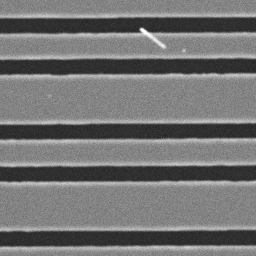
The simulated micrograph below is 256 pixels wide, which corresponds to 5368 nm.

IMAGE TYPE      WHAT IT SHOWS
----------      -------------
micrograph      lines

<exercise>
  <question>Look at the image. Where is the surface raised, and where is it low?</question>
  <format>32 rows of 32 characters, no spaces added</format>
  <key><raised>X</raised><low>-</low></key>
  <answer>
XXXXXXXXXXXXXXXXXXXXXXXXXXXXXXXX
XXXXXXXXXXXXXXXXXXXXXXXXXXXXXXXX
--------------------------------
--------------------------------
XXXXXXXXXXXXXXXXXXXXXXXXXXXXXXXX
XXXXXXXXXXXXXXXXXXXXXXXXXXXXXXXX
XXXXXXXXXXXXXXXXXXXXXXXXXXXXXXXX
--------------------------------
--------------------------------
XXXXXXXXXXXXXXXXXXXXXXXXXXXXXXXX
XXXXXXXXXXXXXXXXXXXXXXXXXXXXXXXX
XXXXXXXXXXXXXXXXXXXXXXXXXXXXXXXX
XXXXXXXXXXXXXXXXXXXXXXXXXXXXXXXX
XXXXXXXXXXXXXXXXXXXXXXXXXXXXXXXX
XXXXXXXXXXXXXXXXXXXXXXXXXXXXXXXX
--------------------------------
--------------------------------
XXXXXXXXXXXXXXXXXXXXXXXXXXXXXXXX
XXXXXXXXXXXXXXXXXXXXXXXXXXXXXXXX
XXXXXXXXXXXXXXXXXXXXXXXXXXXXXXXX
XXXXXXXXXXXXXXXXXXXXXXXXXXXXXXXX
--------------------------------
--------------------------------
XXXXXXXXXXXXXXXXXXXXXXXXXXXXXXXX
XXXXXXXXXXXXXXXXXXXXXXXXXXXXXXXX
XXXXXXXXXXXXXXXXXXXXXXXXXXXXXXXX
XXXXXXXXXXXXXXXXXXXXXXXXXXXXXXXX
XXXXXXXXXXXXXXXXXXXXXXXXXXXXXXXX
XXXXXXXXXXXXXXXXXXXXXXXXXXXXXXXX
--------------------------------
--------------------------------
XXXXXXXXXXXXXXXXXXXXXXXXXXXXXXXX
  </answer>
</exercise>